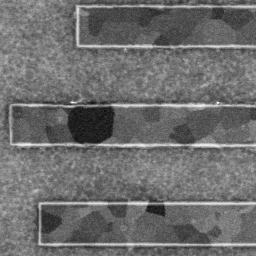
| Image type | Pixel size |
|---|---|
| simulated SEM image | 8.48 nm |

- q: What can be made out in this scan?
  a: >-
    one or a few lines or trenches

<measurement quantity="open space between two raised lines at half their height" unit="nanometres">496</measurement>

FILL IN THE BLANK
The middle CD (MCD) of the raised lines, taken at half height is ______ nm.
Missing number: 338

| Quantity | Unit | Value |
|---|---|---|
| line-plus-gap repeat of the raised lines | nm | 838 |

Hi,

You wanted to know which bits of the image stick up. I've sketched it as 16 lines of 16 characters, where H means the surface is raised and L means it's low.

LLLLLHHHHHHHHHHH
LLLLLHHHHHHHHHHH
LLLLLHHHHHHHHHHH
LLLLLLLLLLLLLLLL
LLLLLLLLLLLLLLLL
LLLLLLLLLLLLLLLL
LLLLLLLLLLLLLLLL
LHHHHHHHHHHHHHHH
LHHHHHHHHHHHHHHH
LLLLLLLLLLLLLLLL
LLLLLLLLLLLLLLLL
LLLLLLLLLLLLLLLL
LLLLLLLLLLLLLLLL
LLLHHHHHHHHHHHHH
LLLHHHHHHHHHHHHH
LLLLLLLLLLLLLLLL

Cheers